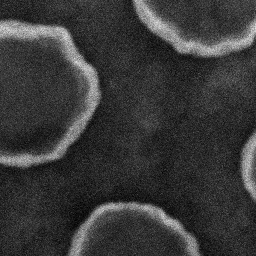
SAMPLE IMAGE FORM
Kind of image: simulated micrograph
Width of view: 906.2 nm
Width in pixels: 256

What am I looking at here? raised bodies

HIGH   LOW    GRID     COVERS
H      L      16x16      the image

LLLLLLLLLHHHHHHH
LLLLLLLLLHHHHHHH
HHHHLLLLLLLHHHHH
HHHHHLLLLLLLLLLL
HHHHHHLLLLLLLLLL
HHHHHHLLLLLLLLLL
HHHHHHLLLLLLLLLL
HHHHHLLLLLLLLLLL
HHHHLLLLLLLLLLLL
HHHHLLLLLLLLLLLL
LLLLLLLLLLLLLLLH
LLLLLLLLLLLLLLLL
LLLLLLLLLLLLLLLL
LLLLLLHHHHLLLLLL
LLLLLHHHHHHHLLLL
LLLLLHHHHHHHLLLL